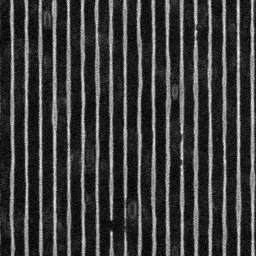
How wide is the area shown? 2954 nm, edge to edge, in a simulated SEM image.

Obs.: parallel lines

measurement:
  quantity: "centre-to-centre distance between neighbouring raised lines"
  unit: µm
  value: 0.163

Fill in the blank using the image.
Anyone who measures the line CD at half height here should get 30.3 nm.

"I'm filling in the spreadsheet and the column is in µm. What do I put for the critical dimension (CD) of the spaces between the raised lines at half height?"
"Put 0.134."